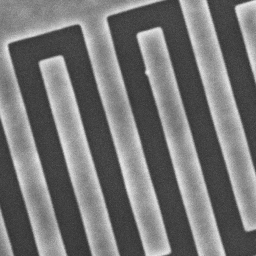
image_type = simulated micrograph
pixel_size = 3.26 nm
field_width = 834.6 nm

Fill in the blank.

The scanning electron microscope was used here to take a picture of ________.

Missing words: groups of lines, slits or small figures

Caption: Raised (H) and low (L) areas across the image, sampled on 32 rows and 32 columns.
HHHHHHHHHHHHHHHHHHLLLLLHHHLLLLHH
HHHHHHHHHHHHHHHLLLLLLLLHHHLLLHHH
HHHHHHHHHHHHHLLLLLLLLLLHHHLLLLHH
HHHHHHHHLLHHHHLLLLLHLLLHHHHLLLHH
HHHHLLLLLLHHHHLLLHHHLLLLHHHLLLHH
HLLLLLLLLLLHHHLLLHHHHLLLHHHLLLLH
HLLLLLLLLLLHHHLLLLHHHLLLHHHHLLLH
HLLLLHHHLLLHHHHLLLHHHLLLLHHHLLLH
HHLLLHHHLLLLHHHLLLHHHHLLLHHHLLLL
HHLLLHHHHLLLHHHLLLHHHHLLLHHHLLLL
HHLLLLHHHLLLHHHHLLLHHHLLLHHHHLLL
HHHLLLHHHLLLHHHHLLLHHHLLLLHHHLLL
HHHLLLHHHHLLLHHHLLLHHHHLLLHHHLLL
HHHLLLHHHHLLLHHHLLLLHHHLLLHHHHLL
HHHLLLLHHHLLLHHHHLLLHHHLLLHHHHLL
HHHHLLLHHHLLLLHHHLLLHHHHLLLHHHLL
LHHHLLLHHHLLLLHHHLLLLHHHLLLHHHHL
LHHHLLLHHHHLLLHHHLLLLHHHLLLHHHHL
LHHHHLLLHHHLLLHHHHLLLHHHLLLLHHHL
LHHHHLLLHHHLLLLHHHLLLHHHHLLLHHHL
LLHHHLLLHHHHLLLHHHLLLLHHHLLLHHHH
LLHHHLLLLHHHLLLHHHHLLLHHHLLLHHHH
LLHHHHLLLHHHLLLLHHHLLLHHHLLLLHHH
LLLHHHLLLHHHHLLLHHHLLLHHHHLLLHHH
LLLHHHLLLHHHHLLLHHHLLLLHHHLLLHHH
LLLHHHHLLLHHHLLLHHHHLLLHHHLLLLHH
LLLHHHHLLLHHHLLLLHHHLLLHHHHLLLHH
LLLLHHHLLLHHHHLLLHHHLLLLHHHLLLHH
HLLLHHHLLLLHHHLLLHHHHLLLHHHLLLLH
HLLLHHHHLLLHHHLLLHHHHLLLHHHHLLLL
HLLLLHHHLLLHHHLLLLHHHLLLHHHHLLLL
HHLLLHHHLLLHHHHLLLHHHLLLLHHHLLLL